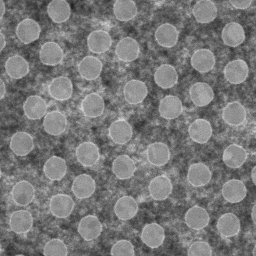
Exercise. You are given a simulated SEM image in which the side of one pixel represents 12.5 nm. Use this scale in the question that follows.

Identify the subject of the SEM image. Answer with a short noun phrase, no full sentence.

a regular array of raised bodies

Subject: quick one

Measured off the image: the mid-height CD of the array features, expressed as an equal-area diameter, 288 nanometers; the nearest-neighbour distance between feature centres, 417 nm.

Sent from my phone